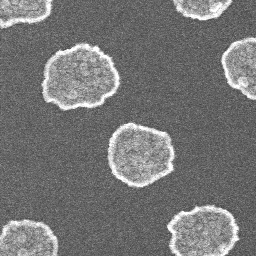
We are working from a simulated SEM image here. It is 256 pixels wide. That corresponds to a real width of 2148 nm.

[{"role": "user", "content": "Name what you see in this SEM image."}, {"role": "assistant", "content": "raised bodies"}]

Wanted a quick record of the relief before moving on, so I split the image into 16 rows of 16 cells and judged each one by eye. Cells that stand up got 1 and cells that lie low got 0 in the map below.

1110000000011100
0000000000000000
0000000000000000
0000110000000011
0001111000000011
0001111000000001
0000110000000000
0000000000000000
0000000111000000
0000000111100000
0000000111100000
0000000010000000
0000000000000000
0000000000011100
1110000000011110
1110000000011100